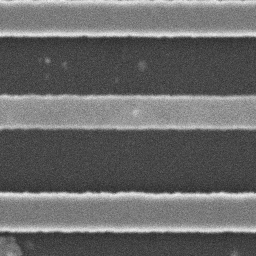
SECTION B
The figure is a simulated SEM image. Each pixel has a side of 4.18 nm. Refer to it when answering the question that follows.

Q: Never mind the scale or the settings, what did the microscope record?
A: lines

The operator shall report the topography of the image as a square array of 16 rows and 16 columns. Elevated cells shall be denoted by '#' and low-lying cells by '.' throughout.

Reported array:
################
################
................
................
................
................
################
################
................
................
................
................
################
################
................
#...............